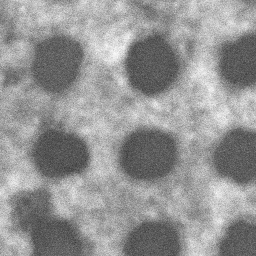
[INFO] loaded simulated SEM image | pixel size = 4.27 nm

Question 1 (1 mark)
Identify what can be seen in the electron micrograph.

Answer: raised bodies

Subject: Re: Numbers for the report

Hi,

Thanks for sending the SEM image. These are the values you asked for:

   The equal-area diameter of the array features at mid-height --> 248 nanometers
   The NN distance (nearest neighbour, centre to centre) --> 89.6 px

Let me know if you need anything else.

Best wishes